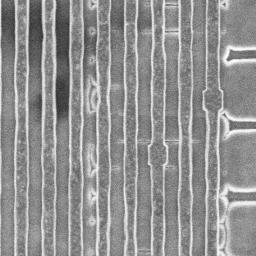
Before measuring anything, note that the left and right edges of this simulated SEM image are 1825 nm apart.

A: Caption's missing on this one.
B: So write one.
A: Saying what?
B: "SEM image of wiring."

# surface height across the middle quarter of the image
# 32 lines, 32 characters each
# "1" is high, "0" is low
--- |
00110000111000011100001110000111
00110000111000011100001110000111
00110000111000011100001110000111
00110000111000011100001110000111
00110000111000011100001110000111
00110000111000011100001110000111
00110000011000001100001110000111
00110000011000001100001110000111
00111000011000001100001110000111
00111000011000001100001110000111
00110000111000011100001110000111
00110000111000011100001110000111
00110000111000011100001110000111
00111000111000011100001110000111
00111000111000011100001110000111
00110000111000011100001110000111
00110000111000011100001110000111
00110000111000011100001110000111
00110000111000011100001110000111
00110000111000011100001110000111
00110000111000011100011110000111
00110000111000011100011111000111
00110000111000011100011111000111
00110000111000011100011111000111
00110000111000011100011111000111
00110000111000011100001110000111
00110000111000011100001110000111
01111000111000011100001110000111
01111000111000011100001110000111
01111000111000011100001110000111
01111000111000011100001110000111
01111000111000011100001110000111